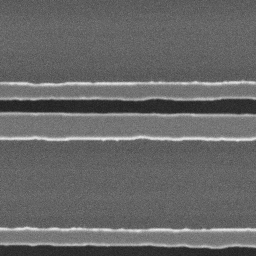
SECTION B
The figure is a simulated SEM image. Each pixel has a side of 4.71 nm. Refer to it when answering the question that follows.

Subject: lines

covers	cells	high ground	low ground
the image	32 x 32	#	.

................................
................................
................................
................................
................................
................................
................................
................................
................................
................................
################################
################################
................................
................................
################################
################################
################################
.............................##.
................................
................................
................................
................................
................................
................................
................................
................................
................................
................................
................................
################################
################################
................................